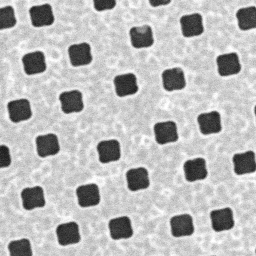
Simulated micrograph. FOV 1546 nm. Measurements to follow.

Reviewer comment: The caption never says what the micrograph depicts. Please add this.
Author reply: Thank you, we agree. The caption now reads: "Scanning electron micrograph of a regular array of holes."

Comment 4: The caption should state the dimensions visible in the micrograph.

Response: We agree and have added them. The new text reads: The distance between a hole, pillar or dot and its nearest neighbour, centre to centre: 281 nm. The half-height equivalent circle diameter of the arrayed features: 152 nm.